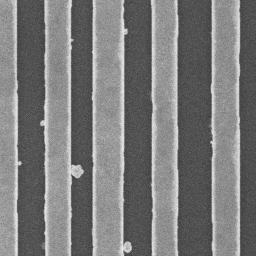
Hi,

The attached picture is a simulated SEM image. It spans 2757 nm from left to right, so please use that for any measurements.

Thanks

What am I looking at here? lines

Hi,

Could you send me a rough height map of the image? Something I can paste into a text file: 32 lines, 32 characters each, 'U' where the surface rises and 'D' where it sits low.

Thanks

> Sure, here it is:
UUDDDDUUUDDDUUUDDDDUUUDDDDDUUUDD
UUDDDDUUUDDDUUUDDDDUUUDDDDDUUUDD
UUDDDDUUUDDDUUUDDDDUUUDDDDDUUUDD
UUDDDDUUUDDDUUUDDDDUUUDDDDDUUUDD
UUDDDDUUUDDDUUUDDDDUUUDDDDDUUUDD
UUDDDDUUUDDDUUUDDDDUUUDDDDDUUUDD
UUDDDDUUUDDDUUUDDDDUUUDDDDDUUUDD
UUDDDDUUUDDDUUUDDDDUUUDDDDDUUUDD
UUDDDDUUUDDDUUUDDDDUUUDDDDDUUUDD
UUDDDDUUUDDDUUUDDDDUUUDDDDDUUUDD
UUDDDDUUUDDDUUUDDDDUUUDDDDDUUUDD
UUDDDDUUUDDDUUUDDDDUUUDDDDDUUUDD
UUDDDDUUUDDDUUUDDDDUUUDDDDDUUUDD
UUDDDDUUUDDDUUUDDDDUUUDDDDDUUUDD
UUDDDDUUUDDDUUUDDDDUUUDDDDDUUUDD
UUDDDDUUUDDDUUUDDDDUUUDDDDDUUUDD
UUDDDDUUUDDDUUUDDDDUUUDDDDDUUUDD
UUDDDDUUUDDDUUUDDDDUUUDDDDDUUUDD
UUDDDDUUUDDDUUUDDDDUUUDDDDDUUUDD
UUDDDDUUUDDDUUUDDDDUUUDDDDDUUUDD
UUDDDDUUUDDDUUUDDDDUUUDDDDDUUUDD
UUDDDDUUUDDDUUUDDDDUUUDDDDDUUUDD
UUDDDDUUUDDDUUUDDDDUUUDDDDDUUUDD
UUDDDDUUUDDDUUUDDDDUUUDDDDDUUUDD
UUDDDDUUUDDDUUUDDDDUUUDDDDDUUUDD
UUDDDDUUUDDDUUUDDDDUUUDDDDDUUUDD
UUDDDDUUUDDDUUUDDDDUUUDDDDDUUUDD
UUDDDDUUUDDDUUUDDDDUUUDDDDDUUUDD
UUDDDDUUUDDDUUUDDDDUUUDDDDDUUUDD
UUDDDDUUUDDDUUUDDDDUUUDDDDDUUUDD
UUDDDDUUUDDDUUUDDDDUUUDDDDDUUUDD
UUDDDDUUUDDDUUUDDDDUUUDDDDDUUUDD